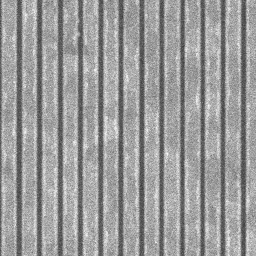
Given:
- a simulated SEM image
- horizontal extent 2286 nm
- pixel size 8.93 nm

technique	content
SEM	parallel lines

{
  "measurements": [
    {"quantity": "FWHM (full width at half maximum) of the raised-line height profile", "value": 128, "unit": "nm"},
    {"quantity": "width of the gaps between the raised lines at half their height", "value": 0.0592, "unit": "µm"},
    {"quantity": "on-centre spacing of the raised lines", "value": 0.182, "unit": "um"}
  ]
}